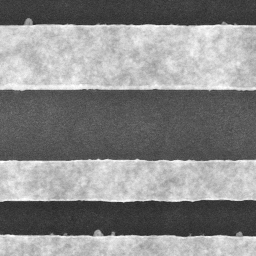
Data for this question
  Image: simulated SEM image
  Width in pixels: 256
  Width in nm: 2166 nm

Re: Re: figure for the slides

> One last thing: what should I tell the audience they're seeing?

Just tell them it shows lines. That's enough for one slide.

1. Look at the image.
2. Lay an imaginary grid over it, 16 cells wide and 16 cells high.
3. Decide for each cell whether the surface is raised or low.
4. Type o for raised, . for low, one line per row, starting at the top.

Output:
................
................
oooooooooooooooo
oooooooooooooooo
oooooooooooooooo
oooooooooooooooo
................
................
................
................
oooooooooooooooo
oooooooooooooooo
ooooooooooooo.oo
................
................
oooooooooooooooo